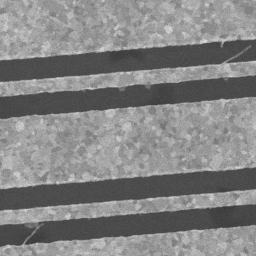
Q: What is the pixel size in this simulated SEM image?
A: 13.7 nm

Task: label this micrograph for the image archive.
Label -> lines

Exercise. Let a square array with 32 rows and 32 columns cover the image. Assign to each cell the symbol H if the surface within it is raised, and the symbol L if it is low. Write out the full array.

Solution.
HHHHHHHHHHHHHHHHHHHHHHHHHHHHHHHH
HHHHHHHHHHHHHHHHHHHHHHHHHHHHHHHH
HHHHHHHHHHHHHHHHHHHHHHHHHHHHHHHH
HHHHHHHHHHHHHHHHHHHHHHHHHHHHHHHH
HHHHHHHHHHHHHHHHHHHHHHHHHHHHHHHH
HHHHHHHHHHHHHHHHHHHHHHHHHLLLLLLL
HHHHHHHHHHHHHLLLLLLLLLLLLLLLLLLL
LLLLLLLLLLLLLLLLLLLLLLLLLLLLLLLL
LLLLLLLLLLLLLLLLLLLLLLHHHHHHHHHH
LLLLLLLLLLHHHHHHHHHHHHHHHHHHHHLL
HHHHHHHHHHHHHHHHHHHHLLLLLLLLLLLL
HHHHHHLLLLLLLLLLLLLLLLLLLLLLLLLL
LLLLLLLLLLLLLLLLLLLLLLLLLLLHHHHH
LLLLLLLLLLLLLLLLHHHHHHHHHHHHHHHH
LLLHHHHHHHHHHHHHHHHHHHHHHHHHHHHH
HHHHHHHHHHHHHHHHHHHHHHHHHHHHHHHH
HHHHHHHHHHHHHHHHHHHHHHHHHHHHHHHH
HHHHHHHHHHHHHHHHHHHHHHHHHHHHHHHH
HHHHHHHHHHHHHHHHHHHHHHHHHHHHHHHH
HHHHHHHHHHHHHHHHHHHHHHHHHHHHHHHH
HHHHHHHHHHHHHHHHHHHHHHHHHHHHHHHH
HHHHHHHHHHHHHHHHHHHHHHHHHLLLLLLL
HHHHHHHHHHHHHLLLLLLLLLLLLLLLLLLL
HLLLLLLLLLLLLLLLLLLLLLLLLLLLLLLL
LLLLLLLLLLLLLLLLLLLLLLHHHHHHHHHH
LLLLLLLLLLHHHHHHHHHHHHHHHHHHHHHL
HHHHHHHHHHHHHHHHHHHHLLLLLLLLLLLL
HHHHHHHHLLLLLLLLLLLLLLLLLLLLLLLL
LLLLLLLLLLLLLLLLLLLLLLLLLLLLHHHH
LLLLLLLLLLLLLLLLHHHHHHHHHHHHHHHH
LLLLHHHHHHHHHHHHHHHHHHHHHHHHHHHH
HHHHHHHHHHHHHHHHHHHHHHHHHHHHHHHH